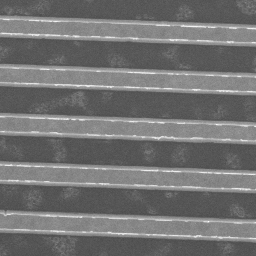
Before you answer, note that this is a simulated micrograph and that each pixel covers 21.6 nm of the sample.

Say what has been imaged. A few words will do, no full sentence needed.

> parallel lines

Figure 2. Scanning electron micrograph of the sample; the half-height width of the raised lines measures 402 nanometres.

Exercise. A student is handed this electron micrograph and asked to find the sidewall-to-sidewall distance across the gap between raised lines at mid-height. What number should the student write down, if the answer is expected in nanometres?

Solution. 642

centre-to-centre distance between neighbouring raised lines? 1.05 um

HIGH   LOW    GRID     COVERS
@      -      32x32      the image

--------------------------------
--------------------------------
@@@@@@@@@-----------------------
@@@@@@@@@@@@@@@@@@@@@@@@@@@@@@@@
---@@@@@@@@@@@@@@@@@@@@@@@@@@@@@
------------------------------@@
--------------------------------
--------------------------------
@@@@@@@@------------------------
@@@@@@@@@@@@@@@@@@@@@@@@@@@@@@@@
-@@@@@@@@@@@@@@@@@@@@@@@@@@@@@@@
---------------------------@@@@@
--------------------------------
--------------------------------
@@@@----------------------------
@@@@@@@@@@@@@@@@@@@@@@@@@@@@@@@-
@@@@@@@@@@@@@@@@@@@@@@@@@@@@@@@@
-------------------------@@@@@@@
--------------------------------
--------------------------------
@@------------------------------
@@@@@@@@@@@@@@@@@@@@@@@@@@@@@@--
@@@@@@@@@@@@@@@@@@@@@@@@@@@@@@@@
---------------------@@@@@@@@@@@
--------------------------------
--------------------------------
--------------------------------
@@@@@@@@@@@@@@@@@@@@@@@@@@------
@@@@@@@@@@@@@@@@@@@@@@@@@@@@@@@@
--------------------@@@@@@@@@@@@
--------------------------------
--------------------------------